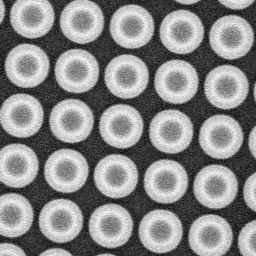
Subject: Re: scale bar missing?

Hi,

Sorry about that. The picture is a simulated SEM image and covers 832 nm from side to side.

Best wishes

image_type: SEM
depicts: an array of small figures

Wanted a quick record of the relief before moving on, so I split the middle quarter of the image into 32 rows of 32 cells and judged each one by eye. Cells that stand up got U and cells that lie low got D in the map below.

UUUUUUUUUDDUUUUUUUUUUDDDUUUUUUUU
UUUUUUUUUDUUUUUUUUUUUDDUUUUUUUUU
UUUUUUUUUDUUUUUUUUUUUDDUUUUUUUUU
UUUUUUUUDDUUUUUUUUUUUDDUUUUUUUUU
UUUUUUUUDDUUUUUUUUUUUDDUUUUUUUUU
UUUUUUUDDDDUUUUUUUUUUDDUUUUUUUUU
UUUUUUDDDDDUUUUUUUUUDDDUUUUUUUUU
DDDDDDDDDDDDUUUUUUUDDDDDUUUUUUUU
DDDDDDDDDDDDDDUUUDDDDDDDUUUUUUUU
UUUUDDDDDDDDDDDDDDDDDDDDDDUUUUDD
UUUUUUDDDDDDUUUUDDDDDDDDDDDDDDDD
UUUUUUUDDDUUUUUUUUDDDDDDDDUDDDDD
UUUUUUUDDDUUUUUUUUUDDDDUUUUUUUDD
UUUUUUUDDUUUUUUUUUUDDDUUUUUUUUUD
UUUUUUUDDUUUUUUUUUUUDDUUUUUUUUUU
UUUUUUUDDUUUUUUUUUUUDUUUUUUUUUUU
UUUUUUUDDUUUUUUUUUUUDUUUUUUUUUUU
UUUUUUDDDUUUUUUUUUUDDUUUUUUUUUUU
UUUUUDDDDDUUUUUUUUUDDUUUUUUUUUUU
UUUDDDDDDDUUUUUUUUDDDDUUUUUUUUUU
DDDDDDDDDDDDUUUUUDDDDDDUUUUUUUUD
UUDDDDDDDDDDDDDDDDDDDDDDUUUUUUDD
UUUUDDDDDDDDDDDDDDDDDDDDDDDDDDDD
UUUUUDDDDDUUUUUUDDDDDDDDDDDDDDDD
UUUUUUDDDUUUUUUUUDDDDDDUUUUUDDDD
UUUUUUDDUUUUUUUUUUDDDUUUUUUUUDDD
UUUUUUDDUUUUUUUUUUDDDUUUUUUUUUDD
UUUUUUDDUUUUUUUUUUDDUUUUUUUUUUUD
UUUUUUDDUUUUUUUUUUDDUUUUUUUUUUUD
UUUUUDDDUUUUUUUUUUDDUUUUUUUUUUUD
UUUUUDDDUUUUUUUUUUDDUUUUUUUUUUUD
UUUDDDDDDUUUUUUUUDDDUUUUUUUUUUDD